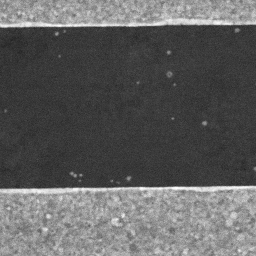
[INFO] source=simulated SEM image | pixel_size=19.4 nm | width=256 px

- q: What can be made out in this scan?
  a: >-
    wiring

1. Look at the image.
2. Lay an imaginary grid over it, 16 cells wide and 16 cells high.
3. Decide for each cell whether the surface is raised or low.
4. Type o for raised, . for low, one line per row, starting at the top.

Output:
oooooooooooooooo
ooooooooo.......
................
................
................
................
................
................
................
................
................
................
oooooooooooooooo
oooooooooooooooo
oooooooooooooooo
oooooooooooooooo